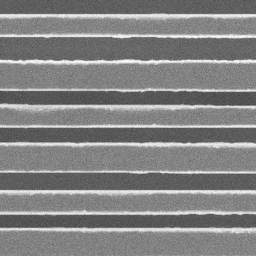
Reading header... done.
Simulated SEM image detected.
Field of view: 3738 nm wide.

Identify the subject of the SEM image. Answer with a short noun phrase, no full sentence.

lines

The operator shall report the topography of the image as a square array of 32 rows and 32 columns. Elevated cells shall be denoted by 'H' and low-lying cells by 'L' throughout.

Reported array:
LLLLLLLLLLLLLLLLLLLLLLLLLLLLLLLL
LLLLLLLLLLLLLLLLLLLLLLLLLLLLLLLL
HHHHHHHHHHHHHHHHHHHHHHHHHHHHHHHH
HHHHHHHHHHHHHHHHHHHHHHHHHHHHHHHH
HHHHHHHHHHHHHHHHHHHHHHHHHHHHHHHH
LLLLLLLLLLLLLLLLLLLLLLLLLLLLLLLL
LLLLLLLLLLLLLLLLLLLLLLLLLLLLLLLL
LLLLLLLLLLLLLLLLLLLLLLLLLLLLLLLL
HHHHHHHHHHHHHHHHHHHHHHHHHHHHHHHH
HHHHHHHHHHHHHHHHHHHHHHHHHHHHHHHH
HHHHHHHHHHHHHHHHHHHHHHHHHHHHHHHH
LLLLLLLLLLLLLLLLLLLLLLLLLLLLLLLL
LLLLLLLLLLLLLLLLLLLLLLLLLLLLLLLL
HHHHHHHHHHHHHHHHHHHHHHHHHHHHHHHH
HHHHHHHHHHHHHHHHHHHHHHHHHHHHHHHH
HHHHHHHHHHHHHHHHHHHHHHHHHHHHHHHH
LLLLLLLLLLLLLLLLLLLLLLLLLLLLLLLL
LLLLLLLLLLLLLLLLLLLLLLLLLLLLLLLL
HHHHHHHHHHHHHHHHHHHHHHHHHHHHHHHH
HHHHHHHHHHHHHHHHHHHHHHHHHHHHHHHH
HHHHHHHHHHHHHHHHHHHHHHHHHHHHHHHH
LLLLLLLLLLLLLLLLHHHLHHHHHHHHHHHH
LLLLLLLLLLLLLLLLLLLLLLLLLLLLLLLL
LLLLLLLLLLLLLLLLLLLLLLLLLLLLLLLL
HHHHHHHHHHHHHHHHHHHHHHHHHHHHHHHH
HHHHHHHHHHHHHHHHHHHHHHHHHHHHHHHH
HHHHHHHHHHHHHHHHHHHHHHHHHHHHHHHH
LLLLLLLLLLLLLLLLLLLLLLLLLLLLLLLL
LLLLLLLLLLLLLLLLLLLLLLLLLLLLLLLL
HHHHHHHHHHHHHHHHHHHHHHHHHHHHHHHH
HHHHHHHHHHHHHHHHHHHHHHHHHHHHHHHH
HHHHHHHHHHHHHHHHHHHHHHHHHHHHHHHH